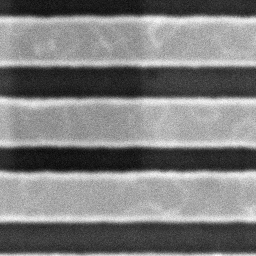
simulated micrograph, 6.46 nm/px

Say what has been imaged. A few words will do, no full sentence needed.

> lines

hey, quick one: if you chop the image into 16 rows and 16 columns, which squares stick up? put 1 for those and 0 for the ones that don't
0000000000000000
1111111111111111
1111111111111111
1111111111111111
0000000000000000
0000000000000000
1111111111111111
1111111111111111
1111111111111111
0000000000000000
0000000000000000
1111111111111111
1111111111111111
1111111111111111
0000000000000000
0000000000000000